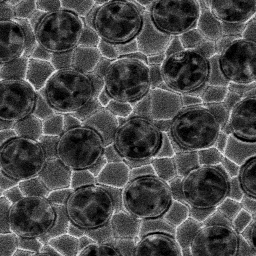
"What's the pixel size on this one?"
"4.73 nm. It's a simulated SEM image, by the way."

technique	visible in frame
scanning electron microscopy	a regular array of raised bodies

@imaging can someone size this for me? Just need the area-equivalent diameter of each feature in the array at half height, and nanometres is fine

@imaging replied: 194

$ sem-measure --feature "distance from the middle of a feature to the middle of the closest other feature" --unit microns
0.275